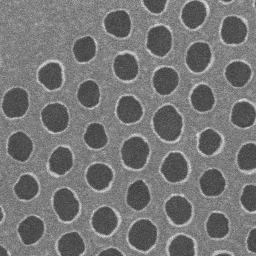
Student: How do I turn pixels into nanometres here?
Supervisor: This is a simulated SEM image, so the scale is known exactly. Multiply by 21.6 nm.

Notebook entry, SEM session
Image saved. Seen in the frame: a regular array of holes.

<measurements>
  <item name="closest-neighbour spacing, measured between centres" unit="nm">890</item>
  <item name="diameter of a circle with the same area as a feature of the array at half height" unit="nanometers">593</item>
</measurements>